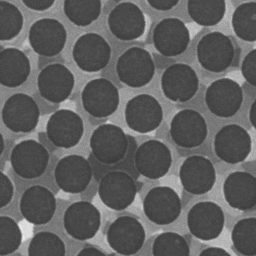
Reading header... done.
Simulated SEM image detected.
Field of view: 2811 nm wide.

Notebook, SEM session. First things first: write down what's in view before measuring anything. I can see a regular array of holes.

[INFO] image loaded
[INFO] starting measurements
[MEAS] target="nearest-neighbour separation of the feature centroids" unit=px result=46.3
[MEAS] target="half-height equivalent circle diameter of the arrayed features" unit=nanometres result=430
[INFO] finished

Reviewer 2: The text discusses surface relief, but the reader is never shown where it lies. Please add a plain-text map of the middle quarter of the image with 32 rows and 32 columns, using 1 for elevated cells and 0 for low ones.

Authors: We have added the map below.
11100000000110000000000111000001
01110000011110000000000110000000
00111111111110000000000110000000
00011111001111000000001100000000
00011100000011000000011100000000
00011000000001110000111100000000
00111000000001111111111100000000
00110000000000111110011110000000
01110000000000111000000111000000
11111000000000110000000011111001
11111000000000100000000011111111
00111000000001100000000001111000
00011100000011100000000001110000
00001111001111100000000001100000
00000111111111100000000011100000
00000111100000110000000011100000
00000111000000011000000111000000
00000110000000011111111111100000
00001110000000001111111111100000
00001100000000001111000001110000
00011100000000001110000000110000
11111110000000001100000000111111
11111110000000001100000000011111
00000111000000011100000000011110
00000011100001111100000000011100
00000001111111111100000000011000
00000001111111111100000000111000
00000001110000001110000000111000
00000001100000000111100011111000
00000001100000000011111111111000
00000011100000000011111101111100
00000111100000000011110000011100